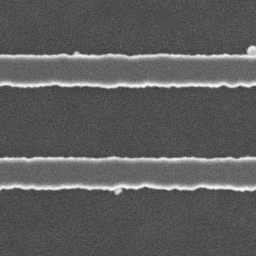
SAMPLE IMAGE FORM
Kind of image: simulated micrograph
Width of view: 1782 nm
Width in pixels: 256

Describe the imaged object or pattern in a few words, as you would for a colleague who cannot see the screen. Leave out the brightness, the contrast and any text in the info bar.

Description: lines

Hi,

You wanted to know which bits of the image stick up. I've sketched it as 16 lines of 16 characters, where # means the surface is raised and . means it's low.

................
................
................
########.#######
################
................
................
................
................
................
################
################
................
................
................
................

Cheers